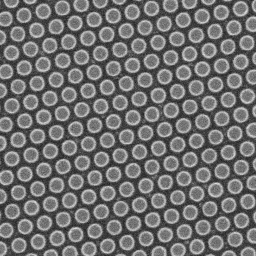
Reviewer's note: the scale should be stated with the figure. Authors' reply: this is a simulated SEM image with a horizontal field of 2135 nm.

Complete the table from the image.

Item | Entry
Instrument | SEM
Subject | a regular array of raised bodies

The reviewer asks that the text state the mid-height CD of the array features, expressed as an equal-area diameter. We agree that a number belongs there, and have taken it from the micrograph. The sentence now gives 119 nm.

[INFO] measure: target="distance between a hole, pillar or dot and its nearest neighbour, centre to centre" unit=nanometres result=161